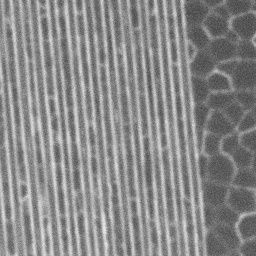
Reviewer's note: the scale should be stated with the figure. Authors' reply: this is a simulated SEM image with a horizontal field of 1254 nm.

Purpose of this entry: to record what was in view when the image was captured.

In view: parallel lines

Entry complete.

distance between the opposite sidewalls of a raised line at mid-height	54.9	nm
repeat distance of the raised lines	88.2	nanometers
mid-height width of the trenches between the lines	33.5	nm